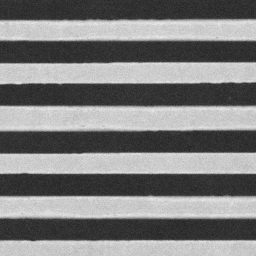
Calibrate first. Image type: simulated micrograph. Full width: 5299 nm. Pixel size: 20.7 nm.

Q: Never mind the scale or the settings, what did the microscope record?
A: lines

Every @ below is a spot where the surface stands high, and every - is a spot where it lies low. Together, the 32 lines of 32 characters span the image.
--------------------------------
--------------------------------
---------------@-@@@@@-@@@@@@@@@
@@@@@@@@@@@@@@@@@@@@@@@@@@@@@@@@
@@@@@@@@@@@@@@@@@@@@@@@@@@@@@@@@
--------------------------------
--------------------------------
--------------------------------
@@@@@@@@@@@@@@@@@@@@@@@@@@@@@@@@
@@@@@@@@@@@@@@@@@@@@@@@@@@@@@@@@
--------------------------------
--------------------------------
--------------------------------
@@@@@@@@@@@@@@@@@@@@@@@@@@@@@@@@
@@@@@@@@@@@@@@@@@@@@@@@@@@@@@@@@
@@@@@@@@@@@@@@@@@@@@@@@@@@@@@@@@
--------------------------------
--------------------------------
--------------------------------
@@@@@@@@@@@@@@@@@@@@@@@@@@@@@@@@
@@@@@@@@@@@@@@@@@@@@@@@@@@@@@@@@
@@@@@@@@@@@@@@@@@@@@@@@@@@@@@@@@
--------------------------------
--------------------------------
--------------------------------
@@@@@@@@@@@@@@@@@@@@@@@@@@@@@@@@
@@@@@@@@@@@@@@@@@@@@@@@@@@@@@@@@
--------------------------------
--------------------------------
--------------------------------
@@@@@@@@@@@@@@@@@@@@@@@@@@@@@@@@
@@@@@@@@@@@@@@@@@@@@@@@@@@@@@@@@